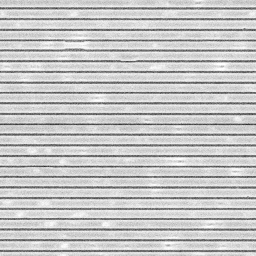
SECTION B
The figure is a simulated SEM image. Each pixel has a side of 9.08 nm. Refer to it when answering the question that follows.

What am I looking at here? parallel lines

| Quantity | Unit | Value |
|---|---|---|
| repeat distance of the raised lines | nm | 95.7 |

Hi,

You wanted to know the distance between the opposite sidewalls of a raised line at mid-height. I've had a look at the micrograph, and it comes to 8 px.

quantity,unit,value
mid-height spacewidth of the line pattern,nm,23.8